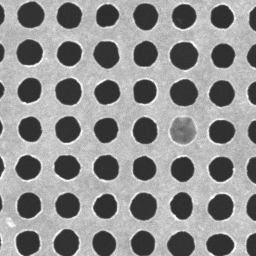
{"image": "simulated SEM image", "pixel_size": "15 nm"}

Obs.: a regular array of holes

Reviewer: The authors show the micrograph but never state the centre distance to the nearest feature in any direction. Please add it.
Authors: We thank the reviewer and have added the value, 564 nm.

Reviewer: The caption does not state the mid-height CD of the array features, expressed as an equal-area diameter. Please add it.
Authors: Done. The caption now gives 25.5 pixels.